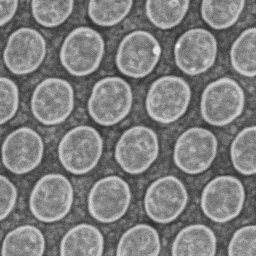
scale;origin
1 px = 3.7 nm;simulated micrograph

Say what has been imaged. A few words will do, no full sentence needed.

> a regular array of raised bodies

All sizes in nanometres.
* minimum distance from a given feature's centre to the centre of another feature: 205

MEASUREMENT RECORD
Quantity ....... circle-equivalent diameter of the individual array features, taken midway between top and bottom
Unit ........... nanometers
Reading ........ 159